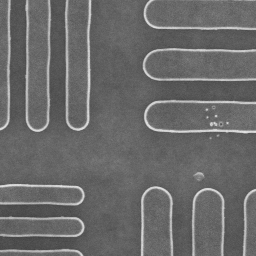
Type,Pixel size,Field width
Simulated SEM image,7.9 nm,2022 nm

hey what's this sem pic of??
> groups of lines, slits or small figures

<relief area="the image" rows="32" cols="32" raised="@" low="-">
@--@@@--@@@-------@@@@@@@@@@@@@@
@--@@@--@@@-------@@@@@@@@@@@@@@
@--@@@--@@@-------@@@@@@@@@@@@@@
@--@@@--@@@-------------------@@
@--@@@--@@@---------------------
@--@@@--@@@---------------------
@--@@@--@@@--------@@@@@@@@@@@@@
@--@@@--@@@-------@@@@@@@@@@@@@@
@--@@@--@@@-------@@@@@@@@@@@@@@
@--@@@--@@@--------@@@@@@@@@@@@@
@--@@@--@@@---------------------
@--@@@--@@@---------------------
@--@@@--@@@---------------------
@--@@@--@@@--------@@@@@@@@@@@@@
@--@@@--@@@-------@@@@@@@@@@@@@@
@---@@---@@-------@@@@@@@@@@@@@@
--------------------------------
--------------------------------
--------------------------------
--------------------------------
--------------------------------
--------------------------------
--------------------------------
@@@@@@@@@@---------@------------
@@@@@@@@@@--------@@@---@@@@---@
-------@@@--------@@@---@@@@---@
------------------@@@---@@@@---@
@@@@@@@@@@--------@@@---@@@@---@
@@@@@@@@@@--------@@@---@@@@---@
------------------@@@---@@@@---@
------------------@@@---@@@@---@
@@@@@@@@@@--------@@@---@@@@--@@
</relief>